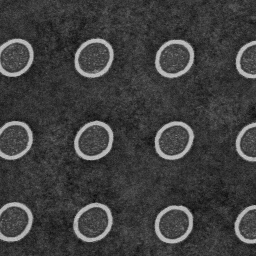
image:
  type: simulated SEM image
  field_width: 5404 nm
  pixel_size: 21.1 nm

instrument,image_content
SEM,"raised bodies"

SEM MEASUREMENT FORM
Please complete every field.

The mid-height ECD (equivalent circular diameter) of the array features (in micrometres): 0.73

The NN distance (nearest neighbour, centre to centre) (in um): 1.7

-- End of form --